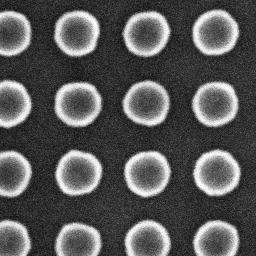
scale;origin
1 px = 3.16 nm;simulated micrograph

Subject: a regular array of raised bodies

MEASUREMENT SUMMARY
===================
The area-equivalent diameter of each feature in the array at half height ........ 131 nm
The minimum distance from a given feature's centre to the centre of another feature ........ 0.218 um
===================